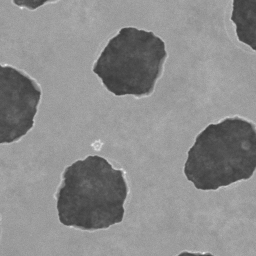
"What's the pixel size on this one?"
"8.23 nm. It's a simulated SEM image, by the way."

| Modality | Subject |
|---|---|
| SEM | holes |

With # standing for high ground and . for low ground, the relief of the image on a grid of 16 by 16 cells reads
###############.
###############.
#######...#####.
######....######
.#####....######
..#####..#######
..##############
..############.#
.###########....
############....
####...#####....
####....####..##
####....########
####....########
################
################